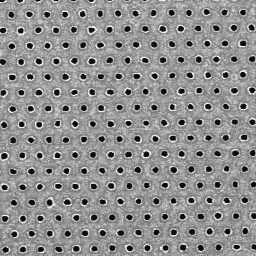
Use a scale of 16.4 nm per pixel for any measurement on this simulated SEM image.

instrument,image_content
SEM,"a regular array of holes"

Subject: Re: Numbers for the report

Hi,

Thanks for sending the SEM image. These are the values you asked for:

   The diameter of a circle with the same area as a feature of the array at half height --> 103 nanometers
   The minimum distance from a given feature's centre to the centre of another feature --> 285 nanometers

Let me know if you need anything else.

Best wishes